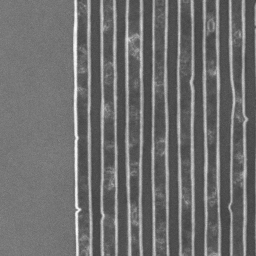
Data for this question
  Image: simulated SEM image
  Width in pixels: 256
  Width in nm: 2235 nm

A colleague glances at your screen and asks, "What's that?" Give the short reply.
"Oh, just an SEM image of parallel lines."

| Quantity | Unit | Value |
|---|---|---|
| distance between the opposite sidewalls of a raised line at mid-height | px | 14.4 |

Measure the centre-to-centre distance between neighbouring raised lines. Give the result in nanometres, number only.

226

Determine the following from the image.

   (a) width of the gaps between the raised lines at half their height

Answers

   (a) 102 nm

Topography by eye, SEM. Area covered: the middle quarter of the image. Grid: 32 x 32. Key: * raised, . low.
...***....***...***...***...****
...***....***...***...***...****
...***....***...***...***...****
...***....***...***...***...****
...***....***...***...***...****
...***....***...***...***...****
...***....***...***...***....***
...***....***...***...***....***
...***....***...***...***....***
...***....***...***...***....***
...***....***...***...****...***
...***....***...***...****...***
...***....***...***...****...***
...***....***...***...****...***
...***....***...***...****...***
...***...****...***...****...***
...***....***...***...****...***
...***....***...***...****...***
...***....***...***...****...***
...***....***...***...****...***
...***....***...***...****...***
...***....***...***...****...***
...***...****...***...****...***
...***...****...***...****...***
...***....***...***...****...***
...***....***...***...****...***
...***....***...***...****...***
...***....***...***...****...***
...***....***...***...****...***
...***....***...***...****...***
...***....***...***...****...***
...***....***...***...****...***